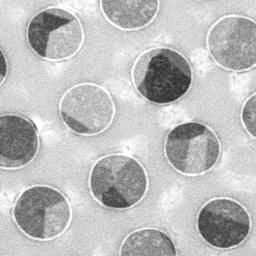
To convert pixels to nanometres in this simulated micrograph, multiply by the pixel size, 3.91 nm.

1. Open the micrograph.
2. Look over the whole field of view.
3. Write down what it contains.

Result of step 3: raised bodies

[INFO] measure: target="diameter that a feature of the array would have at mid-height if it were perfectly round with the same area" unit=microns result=0.215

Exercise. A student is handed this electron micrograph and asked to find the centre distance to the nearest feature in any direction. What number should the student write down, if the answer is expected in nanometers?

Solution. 308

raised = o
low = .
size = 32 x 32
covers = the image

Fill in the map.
.............ooooooo............
.....oooo....ooooooo............
....oooooo....ooooo........ooooo
...ooooooo.....ooo........oooooo
...ooooooo................oooooo
....oooooo................oooooo
....oooooo........oooo....oooooo
o.....oo.........oooooo....ooooo
o................ooooooo....ooo.
o................ooooooo........
..........oo.....ooooooo........
........ooooo....oooooo.........
........oooooo....oooo.........o
.......ooooooo................oo
ooo.....oooooo................oo
ooooo...oooooo.........oo.....oo
ooooo....oooo........oooooo....o
ooooo.o..............oooooo.....
ooooo................ooooooo....
oooo.........ooo.....oooooo.....
ooo.........oooooo...oooooo.....
...........ooooooo.....ooo......
...........ooooooo..............
....ooo....ooooooo..............
..oooooo....oooooo..............
..ooooooo....oooo.........oooo..
..ooooooo................oooooo.
..ooooooo................oooooo.
..oooooo..........o......oooooo.
....ooo.........ooooo....oooooo.
...............ooooooo....oooo..
...............ooooooo..........